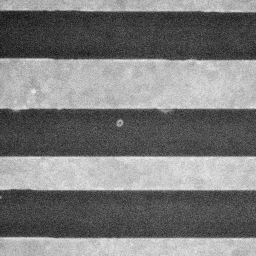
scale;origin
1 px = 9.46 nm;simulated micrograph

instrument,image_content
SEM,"lines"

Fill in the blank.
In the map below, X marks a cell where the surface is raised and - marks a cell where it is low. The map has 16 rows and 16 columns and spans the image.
XXXXXXXXXXXXXXXX
----------------
----------------
----------------
XXXXXXXXXXXXXXXX
XXXXXXXXXXXXXXXX
XXXXXXXXXXXXXXXX
----------------
----------------
----------------
XXXXXXXXXXXXXXXX
XXXXXXXXXXXXXXXX
----------------
----------------
----------------
XXXXXXXXXXXXXXXX